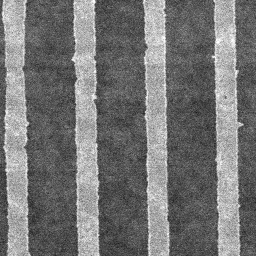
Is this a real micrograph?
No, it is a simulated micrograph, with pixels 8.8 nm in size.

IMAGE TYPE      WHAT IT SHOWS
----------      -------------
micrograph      one or a few lines or trenches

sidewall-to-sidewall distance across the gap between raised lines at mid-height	448	nm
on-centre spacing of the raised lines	70.3	pixels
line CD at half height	169	nm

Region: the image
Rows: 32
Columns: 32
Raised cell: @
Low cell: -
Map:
@@@------@@@------@@@------@@---
@@@------@@@------@@@------@@---
@@@------@@@------@@@------@@---
-@@------@@@------@@@------@@---
-@@------@@@------@@@------@@---
-@@-------@@------@@@------@@---
-@@------@@@------@@@------@@---
-@@------@@@------@@@------@@---
-@@------@@@------@@@------@@---
-@@-------@@------@@@------@@---
-@@-------@@------@@@------@@@--
-@@------@@@------@@@-------@@--
-@@-------@@------@@@------@-@--
-@@-------@@------@@@------@@@--
--@-------@@------@@@------@@@--
--@-------@@------@@@------@@@--
-@--------@@------@@@------@@@--
-@@-------@@------@@@------@@@--
-@@-------@@-------@@------@@@--
-@@-------@@------@@@------@@@--
-@@-------@@------@@@------@@@--
-@@-------@@------@@@------@@@--
-@@-------@@-------@@------@@@--
-@@-------@@------@@@------@@@--
-@@-------@@--------@------@@@--
-@@-------@@-------@@------@@@--
-@@-------@@-------@@------@@@--
-@@-------@@-------@@------@@@--
-@@-------@@-------@@------@@@--
-@@-------@@-------@@------@@@--
-@@-------@@-------@@------@@@--
-@@@------@@-------@@------@@@--